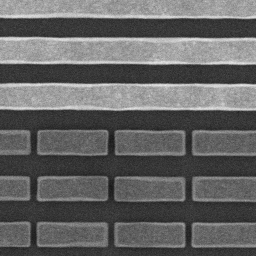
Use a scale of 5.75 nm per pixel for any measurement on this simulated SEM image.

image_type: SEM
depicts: wiring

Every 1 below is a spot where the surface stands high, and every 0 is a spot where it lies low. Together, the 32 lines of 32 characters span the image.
11111111111111111111111111111111
11111111111111111111111111111111
00000000000000000000000000000000
00000000000000000000000000000000
00000000000000000000000000000000
11111111111111111111111111111111
11111111111111111111111111111111
11111111111111111111111111111111
00000000000000000000000000000000
00000000000000000000000000000000
00000000000000000000000000000000
11111111111111111111111111111111
11111111111111111111111111111111
01111111000111111111111111111111
00000000000000000000000000000000
00000000000000000000000000000000
00000111111110011110000000000000
11110111111110111111111011111111
11110111111110111111111011111111
00000000000000000000000000000000
00000000000000000000000000000000
00000000000000000000000000000000
11100111111110111111110011111111
11110111111110111111111011111111
11110111111110111111111011111111
00000000000000000000000000000000
00000000000000000000000000000000
00000000000000000000000000000000
11110111111110011111111011111111
11110111111110011111111011111111
11100111100000011111111011111111
00000000000000000000000000000000